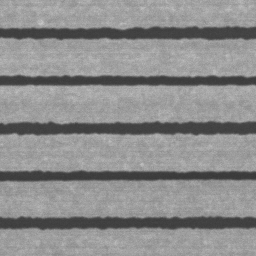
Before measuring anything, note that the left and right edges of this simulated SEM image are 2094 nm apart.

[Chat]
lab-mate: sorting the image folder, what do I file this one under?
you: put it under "lines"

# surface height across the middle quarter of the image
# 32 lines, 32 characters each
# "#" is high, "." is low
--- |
################################
################################
################################
................................
................................
......####........###..##.......
################################
################################
################################
################################
################################
################################
################################
################################
#############.######....#....#..
................................
................................
..#.#..#..#............#....#..#
################################
################################
################################
################################
################################
################################
################################
################################
################################
................................
................................
.###############################
################################
################################